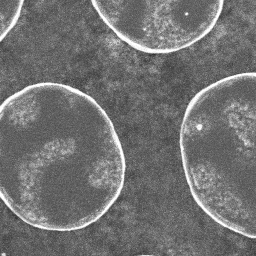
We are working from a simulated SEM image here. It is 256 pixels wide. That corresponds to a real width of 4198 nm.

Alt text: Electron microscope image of raised bodies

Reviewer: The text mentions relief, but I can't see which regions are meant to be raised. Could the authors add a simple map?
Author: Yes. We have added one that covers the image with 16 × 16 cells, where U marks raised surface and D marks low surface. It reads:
UDDDDDUUUUUUUUDD
UDDDDDDUUUUUUDDD
DDDDDDDDUUUUDDDD
DDDDDDDDDDDDDDDD
DDDDDDDDDDDDDDDD
DDUUDDDDDDDDDUUU
UUUUUUDDDDDDUUUU
UUUUUUUDDDDUUUUU
UUUUUUUDDDDUUUUU
UUUUUUUUDDDUUUUU
UUUUUUUUDDDDUUUU
UUUUUUUUDDDDUUUU
UUUUUUUDDDDDUUUU
DUUUUUDDDDDDDUUU
DDDDDDDDDDDDDDDU
DDDDDDDDDDDDDDDD